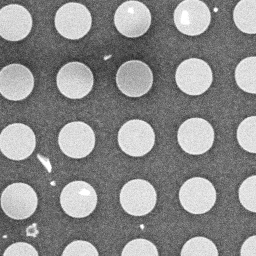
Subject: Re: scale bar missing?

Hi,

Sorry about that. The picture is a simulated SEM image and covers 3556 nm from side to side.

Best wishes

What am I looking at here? an array of small figures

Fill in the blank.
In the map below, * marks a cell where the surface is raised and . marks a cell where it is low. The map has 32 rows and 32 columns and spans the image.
........**.....***.....***....**
***....****....****...****...***
****...****...*****...****...***
****...****....***....****....**
***.....**......*...............
................................
................................
.......................**.....**
.**.....***....****...****....**
****...*****...****...****...***
****...*****...****...****....**
****....***....***.....**......*
................................
................................
................................
.........**.....**.....***....**
****....****...****...*****...**
****...*****...****...*****...**
****....****...****....***....**
.**......**.....................
................................
................................
.................*......**.....*
.***....****...****....****...**
*****...****...****...*****...**
*****...****...****....****...**
.***....***.....***.....**......
................................
................................
................................
..*......**.....***....****...**
.****...****...*****...****...**